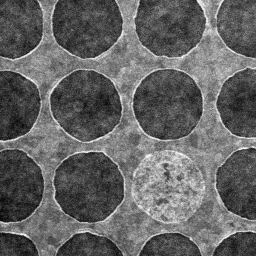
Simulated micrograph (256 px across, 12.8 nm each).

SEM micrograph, holes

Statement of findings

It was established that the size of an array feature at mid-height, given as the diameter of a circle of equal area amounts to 916 nm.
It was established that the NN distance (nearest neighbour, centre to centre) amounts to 1020 nm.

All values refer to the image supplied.